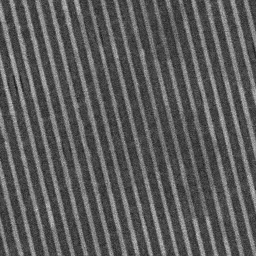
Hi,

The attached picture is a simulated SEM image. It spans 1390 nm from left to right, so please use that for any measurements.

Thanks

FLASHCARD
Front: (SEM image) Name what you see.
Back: parallel lines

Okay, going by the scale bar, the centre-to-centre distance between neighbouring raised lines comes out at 68.7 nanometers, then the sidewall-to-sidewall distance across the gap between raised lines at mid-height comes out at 49.5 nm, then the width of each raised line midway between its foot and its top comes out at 17.8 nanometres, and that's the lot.